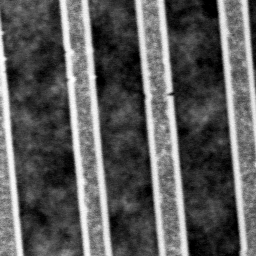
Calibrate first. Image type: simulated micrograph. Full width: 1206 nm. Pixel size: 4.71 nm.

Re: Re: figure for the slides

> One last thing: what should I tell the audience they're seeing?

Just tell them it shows one or a few lines or trenches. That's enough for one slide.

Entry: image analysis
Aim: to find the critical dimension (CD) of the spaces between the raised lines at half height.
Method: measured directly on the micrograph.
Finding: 272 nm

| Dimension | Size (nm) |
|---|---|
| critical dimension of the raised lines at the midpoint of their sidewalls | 115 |